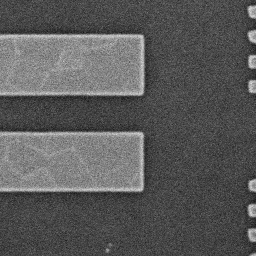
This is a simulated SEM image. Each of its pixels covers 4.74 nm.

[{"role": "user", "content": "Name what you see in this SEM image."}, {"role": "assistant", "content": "wiring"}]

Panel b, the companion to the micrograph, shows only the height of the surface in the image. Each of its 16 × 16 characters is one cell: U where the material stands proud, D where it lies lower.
DDDDDDDDDDDDDDDD
DDDDDDDDDDDDDDDD
UUUUUUUUUDDDDDDD
UUUUUUUUUDDDDDDD
UUUUUUUUUDDDDDDD
UUUUUUUUUDDDDDDD
DDDDDDDDDDDDDDDD
DDDDDDDDDDDDDDDD
UUUUUUUUUDDDDDDD
UUUUUUUUUDDDDDDD
UUUUUUUUUDDDDDDD
UUUUUUUUUDDDDDDD
DDDDDDDDDDDDDDDD
DDDDDDDDDDDDDDDD
DDDDDDDDDDDDDDDD
DDDDDDDDDDDDDDDD